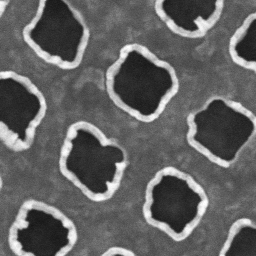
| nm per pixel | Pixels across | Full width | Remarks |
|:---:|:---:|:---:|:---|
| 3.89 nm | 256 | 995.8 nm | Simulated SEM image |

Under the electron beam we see holes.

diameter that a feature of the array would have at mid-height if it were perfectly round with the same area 216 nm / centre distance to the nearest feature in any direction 0.348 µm